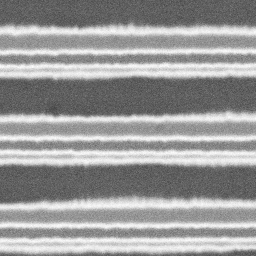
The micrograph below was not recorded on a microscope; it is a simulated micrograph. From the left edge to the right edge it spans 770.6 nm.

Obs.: lines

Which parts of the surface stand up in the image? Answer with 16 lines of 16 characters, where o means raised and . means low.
................
................
oooooooooooooooo
oooooooooooooooo
oooooooooooooooo
................
................
oooooooooooooooo
oooooooooooooooo
oooooooooooooooo
................
................
................
oooooooooooooooo
oooooooooooooooo
ooooo.oooooooo..